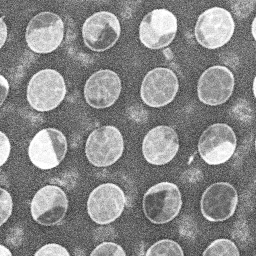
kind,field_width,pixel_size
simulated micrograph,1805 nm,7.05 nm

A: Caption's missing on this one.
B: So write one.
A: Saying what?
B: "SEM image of a regular array of raised bodies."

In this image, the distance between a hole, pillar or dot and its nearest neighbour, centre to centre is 398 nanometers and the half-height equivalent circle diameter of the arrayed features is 266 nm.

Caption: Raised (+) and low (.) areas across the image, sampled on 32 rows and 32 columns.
................................
...................++.....++....
....++++...++++...++++...++++...
+...++++..+++++..+++++...++++...
+..+++++..+++++...++++...++++...
....+++....+++....+++....+++....
.....+..........................
................................
..........................++....
....++++...++++...++++...++++...
+...++++...++++...++++...++++...
+..+++++...++++...++++...++++...
+...++++...+++....+++....+++....
....+++.........................
................................
................................
.....++.....+++....+++....+++...
+...++++...++++...++++...++++...
+...++++...++++...++++...++++...
+...++++...++++...++++...++++...
....+++.....++..................
................................
................................
.....++.....+++....+++....+++...
+...++++...++++...++++...+++++..
+...++++...++++...+++++..++++...
+...++++...++++...++++...++++...
+....+++....++.....++.....++....
................................
................................
.............+.....+++.....++...
+....+++....+++....++++...++++..